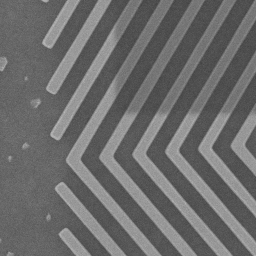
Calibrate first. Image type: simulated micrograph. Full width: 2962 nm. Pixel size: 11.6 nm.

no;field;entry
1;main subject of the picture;groups of lines, slits or small figures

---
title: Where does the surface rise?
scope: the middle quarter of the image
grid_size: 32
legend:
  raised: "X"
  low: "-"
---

XX-----XXX-----XXX----XXX-----XX
X-----XXX-----XXX-----XXX-----XX
X-----XX-----XXX-----XXX-----XXX
-----XXX-----XXX-----XXX-----XX-
-----XX-----XXX-----XXX-----XXX-
----XXX-----XXX----XXX-----XXX--
---XXX-----XXX-----XXX-----XXX--
---XXX----XXX-----XXX-----XXX---
--XXX-----XXX-----XX-----XXX----
-XXX-----XXX-----XXX-----XXX----
-XXX-----XXX----XXX-----XXX-----
XXX-----XXX-----XXX-----XXX-----
XXX----XXX-----XXX-----XXX-----X
XX-----XXX-----XXX----XXX-----XX
X-----XXX-----XXX-----XXX-----XX
X-----XXX-----XX-----XXX-----XXX
-----XXX-----XXX-----XXX-----XXX
-----XX-----XXX-----XXX-----XXX-
----XXX-----XXX-----XX-----XXX--
---XXX-----XXX-----XXX-----XXX--
---XXX----XXX-----XXX-----XXX---
--XXX-----XXX-----XX------XXX---
-XXXX----XXX-----XXX------XXX---
-XXX-----XXX------XXX------XXX--
-XXX------XXX------XXX-----XXXX-
--XXX-----XXXX-----XXXX-----XXXX
---XXX-----XXXX-----XXXX-----XXX
---XXXX-----XXXX-----XXX------XX
----XXX------XXX------XXX------X
-----XXX------XXX------XXX------
------XXX------XXX-----XXXX-----
X------XXX------XXX-----XXXX----